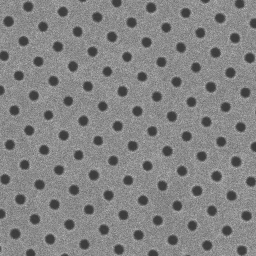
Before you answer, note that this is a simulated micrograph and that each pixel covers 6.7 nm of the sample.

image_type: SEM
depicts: a regular array of holes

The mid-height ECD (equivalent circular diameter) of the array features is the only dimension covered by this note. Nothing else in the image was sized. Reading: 0.0697 microns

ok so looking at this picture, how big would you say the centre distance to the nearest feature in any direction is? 163 nm